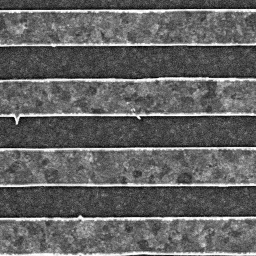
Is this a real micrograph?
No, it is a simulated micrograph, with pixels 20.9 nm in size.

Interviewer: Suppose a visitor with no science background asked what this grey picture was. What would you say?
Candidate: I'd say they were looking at one or a few lines or trenches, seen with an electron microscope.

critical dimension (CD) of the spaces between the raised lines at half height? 705 nm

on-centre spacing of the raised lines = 1450 nm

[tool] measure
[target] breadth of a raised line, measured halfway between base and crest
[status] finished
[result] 0.744 micrometres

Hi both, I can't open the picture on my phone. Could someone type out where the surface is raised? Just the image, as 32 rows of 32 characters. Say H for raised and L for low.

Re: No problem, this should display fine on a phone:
LLLLLLLLLLLLLLLLLLLLLLLLLLLLLLLL
HHHHHHHHHHHHHHHHHHHHHHHHHHHHHHHH
HHHHHHHHHHHHHHHHHHHHHHHHHHHHHHHH
HHHHHHHHHHHHHHHHHHHHHHHHHHHHHHHH
HHHHHHHHHHHHHHHHHHHHHHHHHHHHHHHH
HHHHHHHHHHHHHHHHHHHHHHHHHHHHHHHH
LLLLLLLLLLLLLLLLLLLLLLLLLLLLLLLL
LLLLLLLLLLLLLLLLLLLLLLLLLLLLLLLL
LLLLLLLLLLLLLLLLLLLLLLLLLLLLLLLL
LLLLLLLLLLLLLLLLLLLLLLLLLLLLLLLL
HHHHHHHHHHHHHHHHHHHHHHHHHHHHHHHH
HHHHHHHHHHHHHHHHHHHHHHHHHHHHHHHH
HHHHHHHHHHHHHHHHHHHHHHHHHHHHHHHH
HHHHHHHHHHHHHHHHHHHHHHHHHHHHHHHH
LHHLLLLLLLLLLLLLLLLLLLLLLLLLLLLL
LLLLLLLLLLLLLLLLLLLLLLLLLLLLLLLL
LLLLLLLLLLLLLLLLLLLLLLLLLLLLLLLL
LLLLLLLLLLLLLLLLLLLLLLLLLLLLLLLL
LLLLLLLLLLLLLLLLLLLLLLLLLLLLLLLL
HHHHHHHHHHHHHHHHHHHHHHHHHHHHHHHH
HHHHHHHHHHHHHHHHHHHHHHHHHHHHHHHH
HHHHHHHHHHHHHHHHHHHHHHHHHHHHHHHH
HHHHHHHHHHHHHHHHHHHHHHHHHHHHHHHH
LLLLLLLLLLLLLLLLLLLLLLLLLLLLLLLL
LLLLLLLLLLLLLLLLLLLLLLLLLLLLLLLL
LLLLLLLLLLLLLLLLLLLLLLLLLLLLLLLL
LLLLLLLLLLLLLLLLLLLLLLLLLLLLLLLL
HHHHHHHHHHHHHHHHHHHHHHHHHHHHHHHH
HHHHHHHHHHHHHHHHHHHHHHHHHHHHHHHH
HHHHHHHHHHHHHHHHHHHHHHHHHHHHHHHH
HHHHHHHHHHHHHHHHHHHHHHHHHHHHHHHH
HHHHHHHHHHHHHHHHHHHHHHHHHHHHHHHH